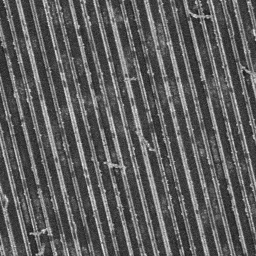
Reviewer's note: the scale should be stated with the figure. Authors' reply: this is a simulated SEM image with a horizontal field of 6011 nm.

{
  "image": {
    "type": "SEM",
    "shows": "parallel lines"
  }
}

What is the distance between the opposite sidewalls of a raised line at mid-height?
3.76 px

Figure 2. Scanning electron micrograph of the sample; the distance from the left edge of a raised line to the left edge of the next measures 291 nanometers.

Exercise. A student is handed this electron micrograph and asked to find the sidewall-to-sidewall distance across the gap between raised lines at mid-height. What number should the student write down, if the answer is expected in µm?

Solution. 0.203